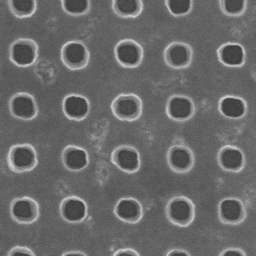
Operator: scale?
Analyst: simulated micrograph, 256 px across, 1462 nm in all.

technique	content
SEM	a regular array of holes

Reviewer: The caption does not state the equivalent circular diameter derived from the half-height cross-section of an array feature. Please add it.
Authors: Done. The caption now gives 0.125 um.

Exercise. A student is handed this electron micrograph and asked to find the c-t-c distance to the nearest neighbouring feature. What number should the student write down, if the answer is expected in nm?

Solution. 288